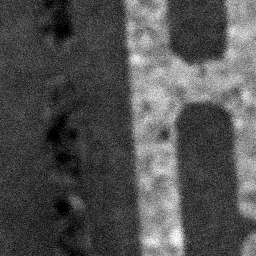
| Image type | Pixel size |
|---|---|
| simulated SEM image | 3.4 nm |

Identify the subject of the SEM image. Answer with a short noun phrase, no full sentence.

one or a few lines or trenches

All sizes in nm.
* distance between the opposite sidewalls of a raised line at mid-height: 127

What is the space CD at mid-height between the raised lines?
196 nanometres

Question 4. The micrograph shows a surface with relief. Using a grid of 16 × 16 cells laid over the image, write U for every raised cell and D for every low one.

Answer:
DDDUUDDDUUDDDDUU
DDDUUDDDUUDDDDUU
DDDUDDDDUUDDDDUU
DDDDDDDDUUUDDDUU
DDDDDDDDUUUUUUUU
DDDUUDDDUUUUUUUU
DDDUUDDDUUUDDDUU
DDDUUDDDUUUDDDDU
DDDUUDDDUUUDDDDU
DDDUUDDDDUUDDDDU
DDDUUDDDDUUDDDDU
DDDDDDDDDUUDDDDU
DDDDUDDDDUUDDDDU
DDDUUDDDDUUDDDDD
DDDUUUDDDUUDDDDD
DDDUUUDDDUUDDDDU